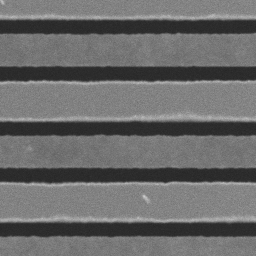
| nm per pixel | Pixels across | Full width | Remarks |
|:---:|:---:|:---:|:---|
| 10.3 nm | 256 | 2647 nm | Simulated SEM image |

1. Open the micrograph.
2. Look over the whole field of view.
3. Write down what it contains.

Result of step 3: lines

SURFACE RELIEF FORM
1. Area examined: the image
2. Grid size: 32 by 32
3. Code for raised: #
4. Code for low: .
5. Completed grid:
################################
################################
......................###..#....
................................
################################
################################
################################
################################
................................
................................
################################
################################
################################
################################
################################
................................
................................
################################
################################
################################
################################
................................
................................
################################
################################
################################
################################
################################
................................
................................
################################
################################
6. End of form